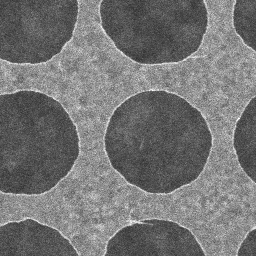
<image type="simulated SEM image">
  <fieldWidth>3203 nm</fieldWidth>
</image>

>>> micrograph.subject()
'holes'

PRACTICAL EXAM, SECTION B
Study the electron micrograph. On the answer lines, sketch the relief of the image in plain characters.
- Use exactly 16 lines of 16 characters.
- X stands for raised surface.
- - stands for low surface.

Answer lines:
-----X-------XX-
-----X-------XX-
----XXX------XX-
---XXXXX----XXXX
XXXXXXXXXXXXXXXX
XXXXXXXXXXXXXXXX
----XXXX----XXXX
----XXX------XX-
-----XX------XX-
-----XX------XX-
----XXX------XX-
----XXXX----XXXX
XXXXXXXXXXXXXXXX
XXXXXXXXXXXXXXXX
----XXX-----XXXX
-----XX------XX-